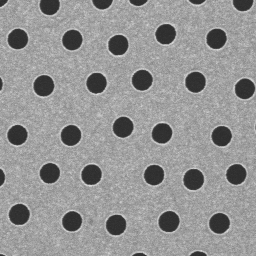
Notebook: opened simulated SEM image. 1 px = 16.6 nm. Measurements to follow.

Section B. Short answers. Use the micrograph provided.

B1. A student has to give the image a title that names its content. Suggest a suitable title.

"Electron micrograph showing a regular array of holes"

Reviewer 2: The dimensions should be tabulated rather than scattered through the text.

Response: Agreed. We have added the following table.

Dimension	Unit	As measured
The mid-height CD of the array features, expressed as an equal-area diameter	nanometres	349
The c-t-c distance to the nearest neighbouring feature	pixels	44.1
